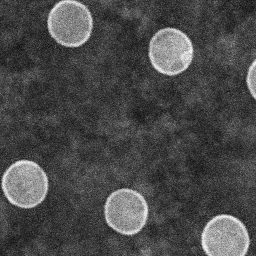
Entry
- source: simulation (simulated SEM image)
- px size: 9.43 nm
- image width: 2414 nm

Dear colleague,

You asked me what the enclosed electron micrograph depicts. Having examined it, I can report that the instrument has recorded raised bodies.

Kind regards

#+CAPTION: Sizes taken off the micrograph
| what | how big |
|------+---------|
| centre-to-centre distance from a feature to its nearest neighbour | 979 nanometres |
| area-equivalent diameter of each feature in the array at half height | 406 nm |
